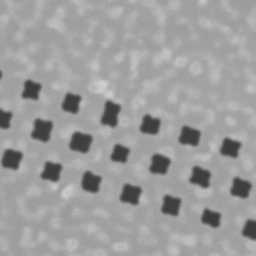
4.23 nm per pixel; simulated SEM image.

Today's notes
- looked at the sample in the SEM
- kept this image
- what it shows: a regular array of holes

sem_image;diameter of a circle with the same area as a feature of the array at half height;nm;84.7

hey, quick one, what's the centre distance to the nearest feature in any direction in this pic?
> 173 nm